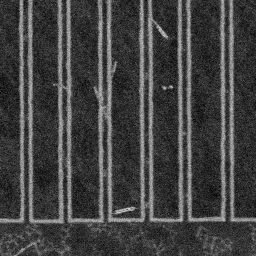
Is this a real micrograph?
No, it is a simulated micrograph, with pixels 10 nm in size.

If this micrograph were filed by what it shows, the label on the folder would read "parallel lines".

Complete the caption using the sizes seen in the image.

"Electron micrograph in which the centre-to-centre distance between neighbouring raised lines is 0.404 microns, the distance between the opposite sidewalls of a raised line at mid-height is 86.6 nm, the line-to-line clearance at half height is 319 nm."